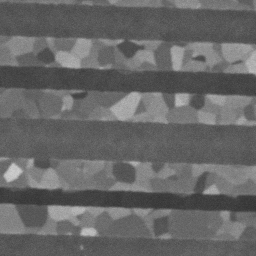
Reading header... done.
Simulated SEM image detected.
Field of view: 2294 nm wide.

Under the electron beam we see lines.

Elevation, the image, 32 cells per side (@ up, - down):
-----------@@@@@@@@@@@@@@@@@@@@@
--------------------------------
--------------------------------
--------------------------------
--------------------------------
@@@@@@@@@@@@@@@@@@@@@@@@@@@-----
@@@@@@@@@@@@@@@@@@@@@@@@@@@@@@@@
@@@@@@@@@@@@@@@@@@@@@@@@@@@@@@@@
-----------@@@@@@@@@@@@@@@@@@@@@
--------------------------------
--------------------------------
@@@@@@@@@@@@@@------------------
@@@@@@@@@@@@@@@@@@@@@@@@@@@@@@@@
@@@@@@@@@@@@@@@@@@@@@@@@@@@@@@@@
@@@@@@@@@@@@@@@@@@@@@@@@@@@@@@@@
-----------------------------@@@
--------------------------------
--------------------------------
--------------------------------
--------------------------------
@@@@@@@@@@@@@@@@@@@@@-----------
@@@@@@@@@@@@@@@@@@@@@@@@@@@@@@@@
@@@@@@@@@@@@@@@@@@@@@@@@@@@@@@@@
----@@@@@@@@@@@@@@@@@@@@@@@@@@@@
--------------------------------
--------------------------------
@@@@@@@@@@@@@@@@@@@@@@@@@@@@@---
@@@@@@@@@@@@@@@@@@@@@@@@@@@@@@@@
@@@@@@@@@@@@@@@@@@@@@@@@@@@@@@@@
-------------@@@@@@@@@@@@@@@@@@@
--------------------------------
--------------------------------